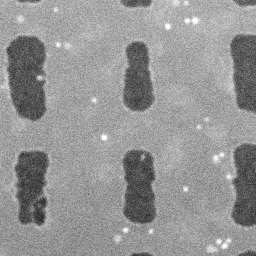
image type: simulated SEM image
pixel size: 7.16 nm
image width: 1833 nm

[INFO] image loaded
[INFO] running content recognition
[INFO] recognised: raised bodies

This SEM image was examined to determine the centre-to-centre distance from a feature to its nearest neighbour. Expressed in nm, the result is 773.